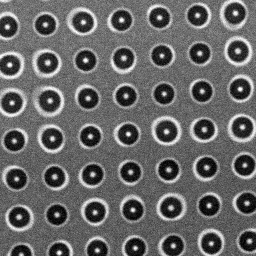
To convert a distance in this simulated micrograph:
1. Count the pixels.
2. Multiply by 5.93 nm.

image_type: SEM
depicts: an array of small figures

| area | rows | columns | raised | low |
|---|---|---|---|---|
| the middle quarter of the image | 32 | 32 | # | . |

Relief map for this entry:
###.....####.....######...######
####...######...################
################################
################################
################################
##############...######....#####
####....#####.....#####.....####
###......####.....####......####
###......####.....####.....#####
###......####.....#####....#####
####....######...###############
################################
################################
#########################.######
#######################.....####
######..######....####.......###
####.....####......###.......###
####.....####......###.......###
####.....####......####......###
####.....#####....######...#####
#####...########################
################################
################################
################################
###############..#######....####
#####....#####.....####......###
#####.....####......###...#..###
.###...#..####.....#####.....###
.###......####.....#####....####
.###.....######...########.#####
######.#########################
################################